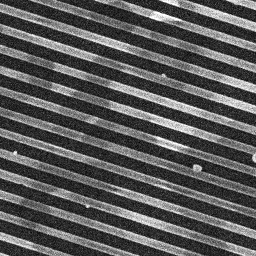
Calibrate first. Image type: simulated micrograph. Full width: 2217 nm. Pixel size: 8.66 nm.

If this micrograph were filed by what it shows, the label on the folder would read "parallel lines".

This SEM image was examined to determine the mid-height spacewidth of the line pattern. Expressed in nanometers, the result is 105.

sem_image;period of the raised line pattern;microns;0.171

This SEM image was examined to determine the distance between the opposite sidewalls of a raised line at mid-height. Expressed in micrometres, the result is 0.067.